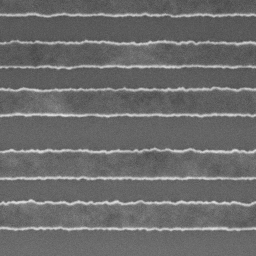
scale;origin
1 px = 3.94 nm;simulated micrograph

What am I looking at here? lines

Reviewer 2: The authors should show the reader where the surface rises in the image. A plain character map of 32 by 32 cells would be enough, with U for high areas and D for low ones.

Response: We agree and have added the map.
UUUUUUUUUUUUUUUUUUUUUUUUUUUUUUUU
UUUUUUUUUUUUUUUUUUUUUUUUUUUUUUUU
DDDDDDDDDDDDDDDDDDDDDDDDDDDDDDDD
DDDDDDDDDDDDDDDDDDDDDDDDDDDDDDDD
DDDDDDDDDDDDDDDDDDDDDDDDDDDDDDDD
UUUUUUUUUUUUUUUUUDUUUUUUUUUUUUUU
UUUUUUUUUUUUUUUUUUUUUUUUUUUUUUUU
UUUUUUUUUUUUUUUUUUUUUUUUUUUUUUUU
DDDDDDDDUDDDDDDDDDDDDDDDDDDDDDDD
DDDDDDDDDDDDDDDDDDDDDDDDDDDDDDDD
DDDDDDDDDDDDDDDDDDDDDDDDDDDDDDDD
UUUUUUUUUUUUUUUUUUUUUUUUUUUUUUUU
UUUUUUUUUUUUUUUUUUUUUUUUUUUUUUUU
UUUUUUUUUUUUUUUUUUUUUUUUUUUUUUUU
DDDDDDDDDDDDDDDDDDDDDDDDDDDDDDDD
DDDDDDDDDDDDDDDDDDDDDDDDDDDDDDDD
DDDDDDDDDDDDDDDDDDDDDDDDDDDDDDDD
DDDDDDDDDDDDDDDDDDDDDDDDDDDDDDDD
DDDDDDDDDDDDDDDDDDDDDDDDDDDDDDDD
UUUUUUUUUUUUUUUUUUUUUUUUUUUUUUUU
UUUUUUUUUUUUUUUUUUUUUUUUUUUUUUUU
UUUUUUUUUUUUUUUUUUUUUUUUUUUUUUUU
DDDDDDDDDDDDDDDDDDDDDDDDDDDDDDDD
DDDDDDDDDDDDDDDDDDDDDDDDDDDDDDDD
DDDDDDDDDDDDDDDDDDDDDDDDDDDDDDDD
UUUUUUUUUUUUUUUUUUUUUUUUUUUUUUUU
UUUUUUUUUUUUUUUUUUUUUUUUUUUUUUUU
UUUUUUUUUUUUUUUUUUUUUUUUUUUUUUUU
UUUUUUUUUUUUUUUUUUUUUUUUUUUUUUUU
DDDDDDDDDDDDDDDDDDDDDDDDDDDDDDDD
DDDDDDDDDDDDDDDDDDDDDDDDDDDDDDDD
DDDDDDDDDDDDDDDDDDDDDDDDDDDDDDDD